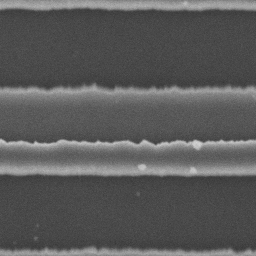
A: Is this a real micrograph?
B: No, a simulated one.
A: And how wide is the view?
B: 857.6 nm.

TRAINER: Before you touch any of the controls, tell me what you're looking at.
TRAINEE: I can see lines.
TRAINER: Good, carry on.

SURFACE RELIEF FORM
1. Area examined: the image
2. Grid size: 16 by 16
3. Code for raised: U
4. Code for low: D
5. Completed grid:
DDUDDDDUUDUUUDDU
DDDDDDDDDDDDDDDD
DDDDDDDDDDDDDDDD
DDDDDDDDDDDDDDDD
DDDDDDDDDDDDDDDD
DDDDDDDDDDDDDDDD
UUUUUUUUUUUUUUUU
UUUUUUUUUUUUUUUU
UUUUUUUUUUUUUUUU
UUUUUUUUUUUUUUUU
UUUUUUUUUUUUUUUU
DDDDDDDDDDDDDDDD
DDDDDDDDDDDDDDDD
DDDDDDDDDDDDDDDD
DDDDDDDDDDDDDDDD
DDDDDDDDDDDDDDDD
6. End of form